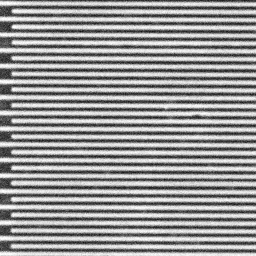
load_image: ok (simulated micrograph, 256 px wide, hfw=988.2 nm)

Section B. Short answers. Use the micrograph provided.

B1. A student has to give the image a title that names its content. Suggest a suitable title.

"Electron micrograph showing parallel lines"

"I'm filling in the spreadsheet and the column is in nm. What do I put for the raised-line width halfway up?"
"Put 10.6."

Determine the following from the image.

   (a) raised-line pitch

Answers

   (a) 7.82 pixels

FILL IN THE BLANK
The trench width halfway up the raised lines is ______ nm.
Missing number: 17.8